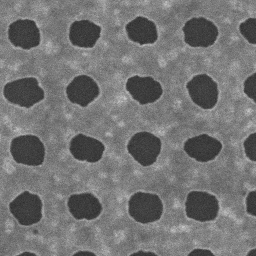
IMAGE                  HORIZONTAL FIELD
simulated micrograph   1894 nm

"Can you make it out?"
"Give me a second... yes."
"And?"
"a regular array of holes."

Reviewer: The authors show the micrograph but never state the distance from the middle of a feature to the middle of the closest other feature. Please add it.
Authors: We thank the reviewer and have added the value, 427 nm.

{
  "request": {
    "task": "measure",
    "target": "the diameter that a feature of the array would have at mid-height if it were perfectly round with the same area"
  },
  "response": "240 nm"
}